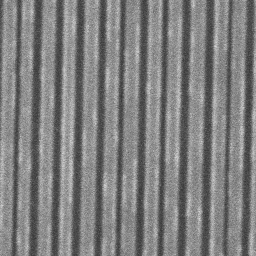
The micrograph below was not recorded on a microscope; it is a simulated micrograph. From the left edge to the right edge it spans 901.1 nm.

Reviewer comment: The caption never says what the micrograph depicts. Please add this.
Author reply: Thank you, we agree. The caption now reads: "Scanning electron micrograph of parallel lines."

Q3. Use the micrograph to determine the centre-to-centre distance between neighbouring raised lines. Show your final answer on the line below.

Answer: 21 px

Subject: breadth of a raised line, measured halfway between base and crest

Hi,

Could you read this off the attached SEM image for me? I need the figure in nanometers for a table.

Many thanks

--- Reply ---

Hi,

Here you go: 44.5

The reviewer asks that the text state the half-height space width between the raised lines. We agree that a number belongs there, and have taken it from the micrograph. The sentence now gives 32.6 nanometers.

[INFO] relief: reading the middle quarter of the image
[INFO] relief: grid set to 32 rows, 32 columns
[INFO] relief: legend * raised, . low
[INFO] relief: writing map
**...***...***.***...***..***...
**...***...***.****..***..***...
**...***...**..****..***..***...
**...***...**..****..***..***...
**...***...**..****..***..***...
**...***...**..***...***..***...
**...***...**..***...***..***...
**...***...**..***...***..***...
**...***...**..***...***..***...
**...***...**..***...***..***..*
**...***...**..***...***..***..*
**...***...**..***...***..***..*
**...***...**..***...***..***..*
**...***...**..***...***..***..*
**...***...**..***...***..***..*
**...***...**..***...***..***..*
**...***..***..***...***..***..*
**...***..***..***...***..***..*
**...***..***..***...***..***..*
**...***..***..***...***..***..*
**...***..***..***...***..**...*
**...***..***..***...***..**...*
**...***..***..***...***..**...*
**...***..***..***...***.***...*
**...***..***..***...***.***...*
**...***..***..***...***..**...*
**...***..***..***...***..**...*
**...***..***..***...**...**...*
**...***..***..***...**...**...*
**...***..***..***...**...**...*
**...***..***..***..***...**...*
**...***..***..***..***...**...*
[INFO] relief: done